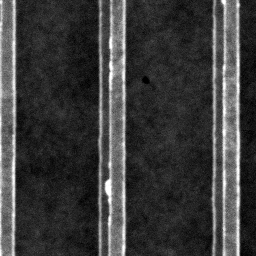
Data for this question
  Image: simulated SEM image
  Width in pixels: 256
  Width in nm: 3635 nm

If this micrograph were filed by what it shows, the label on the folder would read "lines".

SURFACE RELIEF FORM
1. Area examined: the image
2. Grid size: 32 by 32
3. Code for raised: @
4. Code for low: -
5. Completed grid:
@@-----------@@------------@@@--
@@-----------@@------------@@@--
@@-----------@@------------@@@--
@@-----------@@------------@@@--
@@-----------@@------------@@@--
@@-----------@@------------@@@--
@@-----------@@------------@@@--
@@-----------@@------------@@@--
@@-----------@@------------@@@--
@@-----------@@------------@@@--
@@-----------@@------------@@@--
@@-----------@@------------@@@--
@@-----------@@------------@@@--
@@-----------@@------------@@@--
@@-----------@@------------@@@--
@@-----------@@------------@@@--
@@-----------@@------------@@@--
@@-----------@@------------@@@--
@@-----------@@------------@@@--
@@-----------@@------------@@@--
@@-----------@@------------@@@--
@@-----------@@------------@@@--
@@-----------@@------------@@@--
@@-----------@@------------@@@--
@@-----------@@------------@@@--
@@-----------@@------------@@@--
@@-----------@@------------@@@--
@@-----------@@------------@@@--
@@-----------@@------------@@@--
@@-----------@@------------@@@--
@@-----------@@------------@@@--
@@-----------@@------------@@@--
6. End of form